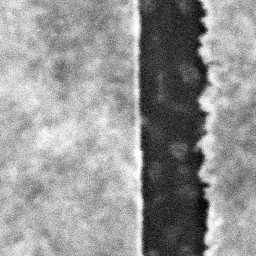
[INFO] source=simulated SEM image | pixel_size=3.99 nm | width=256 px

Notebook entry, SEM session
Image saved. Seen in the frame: one or a few lines or trenches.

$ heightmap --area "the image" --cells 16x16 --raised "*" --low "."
*********....***
*********....***
*********....***
*********....***
*********....***
*********....***
*********....***
*********....***
*********....***
*********....***
*********....***
*********....***
*********....***
*********....***
*********....***
*********....***